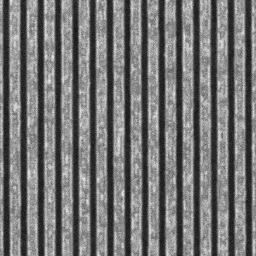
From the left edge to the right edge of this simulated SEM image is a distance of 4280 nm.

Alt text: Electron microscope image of parallel lines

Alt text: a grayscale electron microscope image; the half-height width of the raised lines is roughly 167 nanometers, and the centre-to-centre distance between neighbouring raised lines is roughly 289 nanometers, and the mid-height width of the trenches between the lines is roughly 121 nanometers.